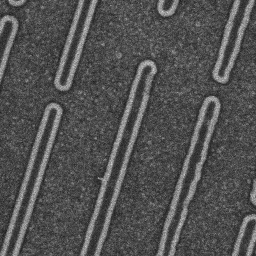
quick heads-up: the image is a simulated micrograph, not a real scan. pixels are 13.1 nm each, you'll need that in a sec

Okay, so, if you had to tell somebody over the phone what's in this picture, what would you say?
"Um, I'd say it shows one or a few lines or trenches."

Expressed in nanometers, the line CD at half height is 162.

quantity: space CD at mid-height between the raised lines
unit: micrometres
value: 0.798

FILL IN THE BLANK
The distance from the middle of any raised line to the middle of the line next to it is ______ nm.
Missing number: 976